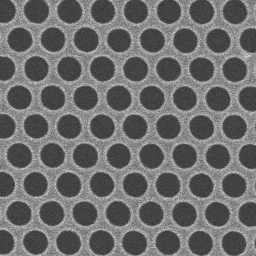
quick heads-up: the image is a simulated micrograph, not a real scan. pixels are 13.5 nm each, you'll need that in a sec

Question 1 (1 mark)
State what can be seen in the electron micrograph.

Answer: a regular array of holes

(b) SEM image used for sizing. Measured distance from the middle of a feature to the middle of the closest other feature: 440 nanometers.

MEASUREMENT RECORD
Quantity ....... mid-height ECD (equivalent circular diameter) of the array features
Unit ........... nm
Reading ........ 335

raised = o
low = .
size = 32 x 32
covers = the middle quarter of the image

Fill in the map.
....oo.......oo......oo......oo.
.....o.......oo......oo......oo.
....ooo.....ooo......oo......ooo
....oooo....oooo....oooo....oooo
o.ooooooo.oooooooooooooooooooooo
oooo..ooooooo.ooooooo.oooooooooo
ooo.....ooo.....oooo....oooo....
oo......oo.......oo......oo.....
oo.......o.......oo......oo.....
ooo.....ooo......oo......oo.....
ooo.....ooo.....oooo.....ooo....
ooooo.oooooo...oooooo..oooooo..o
ooooooooo.ooooooo.oooooooooooooo
...oooo.....ooo.....oooo....oooo
....ooo.....ooo......oo......ooo
....oo.......oo......oo......oo.
....ooo......oo......oo......ooo
....ooo.....ooo.....oooo.....ooo
...ooooo...ooooo....oooo....oooo
oooooooooooooooooooooooooooooooo
ooo....ooooo...ooooo....oooo....
oo......ooo.....ooo......oo.....
oo......ooo......oo......oo.....
oo......ooo......oo......oo.....
ooo.....ooo.....ooo......oo.....
oooo...ooooo...ooooo....oooo....
oooooooooooooooooooooooooooooooo
..oooooo...ooooo...ooooo....oooo
....ooo.....ooo.....ooo......ooo
....oo.......oo......oo......oo.
....ooo......oo......oo......oo.
....ooo.....ooo......oo......oo.